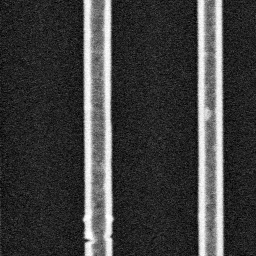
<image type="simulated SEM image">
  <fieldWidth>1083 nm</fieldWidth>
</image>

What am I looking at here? one or a few lines or trenches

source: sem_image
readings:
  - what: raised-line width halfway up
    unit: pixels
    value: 19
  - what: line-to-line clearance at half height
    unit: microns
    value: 0.391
